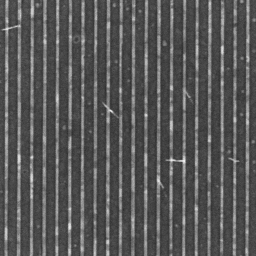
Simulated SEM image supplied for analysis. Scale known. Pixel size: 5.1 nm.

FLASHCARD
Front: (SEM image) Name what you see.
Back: parallel lines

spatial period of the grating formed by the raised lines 0.0647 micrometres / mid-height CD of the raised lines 12.8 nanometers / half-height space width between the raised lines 53.6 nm